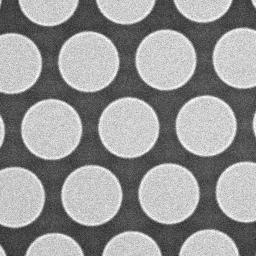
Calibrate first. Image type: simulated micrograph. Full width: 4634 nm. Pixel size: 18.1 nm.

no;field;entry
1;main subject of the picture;an array of small figures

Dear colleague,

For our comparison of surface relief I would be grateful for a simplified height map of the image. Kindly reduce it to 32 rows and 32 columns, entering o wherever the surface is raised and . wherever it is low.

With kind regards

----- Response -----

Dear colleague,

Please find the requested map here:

...ooooooo..ooooooo...ooooooo...
...oooooo....oooooo....ooooo....
....oooo......ooo.......ooo.....
................................
ooo......oooo......oooo.....oooo
oooo....oooooo....oooooo...ooooo
ooooo...ooooooo..ooooooo...ooooo
ooooo..oooooooo..ooooooo...ooooo
ooooo..oooooooo..ooooooo...ooooo
ooooo...oooooo....oooooo...ooooo
oooo.....ooooo.....oooo......ooo
oo..............................
...............oo.......ooo.....
....ooooo....oooooo....oooooo...
...ooooooo...oooooo...ooooooo...
...ooooooo..oooooooo..ooooooo...
...ooooooo..oooooooo..ooooooo...
...ooooooo...oooooo...ooooooo...
....ooooo....oooooo....ooooo....
.....ooo.......oo...............
..............................oo
oooo.....ooooo.....ooooo....oooo
ooooo...ooooooo...oooooo...ooooo
ooooo...ooooooo...ooooooo..ooooo
ooooo...ooooooo..oooooooo..ooooo
ooooo...ooooooo...ooooooo..ooooo
ooooo...ooooooo...oooooo....oooo
oooo.....oooo......oooo.......oo
................................
.....ooo.......ooo......oooo....
....oooooo....ooooo....oooooo...
o..ooooooo...ooooooo...ooooooo..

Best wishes